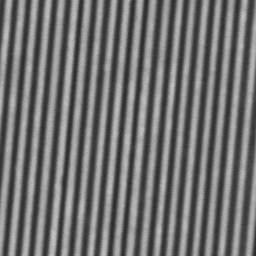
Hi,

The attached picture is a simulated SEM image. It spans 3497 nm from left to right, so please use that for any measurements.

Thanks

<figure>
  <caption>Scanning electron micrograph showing parallel lines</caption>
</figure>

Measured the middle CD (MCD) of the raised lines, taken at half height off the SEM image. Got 88.5 nanometres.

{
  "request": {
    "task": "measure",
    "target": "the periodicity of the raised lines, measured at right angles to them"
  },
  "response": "179 nanometers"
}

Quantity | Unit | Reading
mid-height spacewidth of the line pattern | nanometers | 90.2